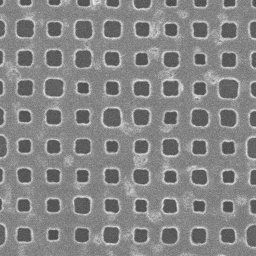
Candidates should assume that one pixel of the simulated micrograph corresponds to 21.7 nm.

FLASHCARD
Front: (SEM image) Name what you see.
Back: a regular array of holes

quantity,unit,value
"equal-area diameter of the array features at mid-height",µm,0.355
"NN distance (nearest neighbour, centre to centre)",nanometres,625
